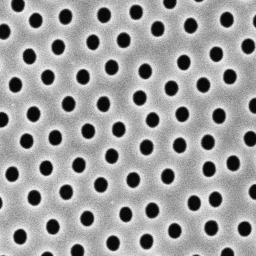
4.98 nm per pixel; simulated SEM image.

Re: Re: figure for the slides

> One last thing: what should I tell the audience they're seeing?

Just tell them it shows a regular array of holes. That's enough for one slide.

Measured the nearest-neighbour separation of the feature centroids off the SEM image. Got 146 nanometres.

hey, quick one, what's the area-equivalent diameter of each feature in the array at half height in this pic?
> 69.8 nm